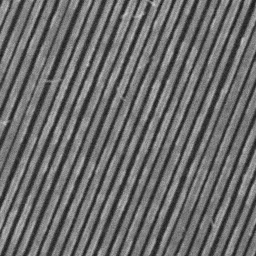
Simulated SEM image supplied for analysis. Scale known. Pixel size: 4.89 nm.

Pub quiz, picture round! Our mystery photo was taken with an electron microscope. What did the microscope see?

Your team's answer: parallel lines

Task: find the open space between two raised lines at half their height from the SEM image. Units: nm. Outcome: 21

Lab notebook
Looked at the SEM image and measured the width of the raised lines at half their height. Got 30.7 nm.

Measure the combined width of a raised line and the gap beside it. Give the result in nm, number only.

52.4